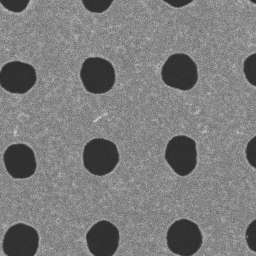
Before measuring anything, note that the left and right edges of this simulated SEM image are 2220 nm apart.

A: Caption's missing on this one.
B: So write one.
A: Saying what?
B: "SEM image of holes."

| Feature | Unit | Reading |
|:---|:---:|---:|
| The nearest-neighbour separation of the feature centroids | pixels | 81.2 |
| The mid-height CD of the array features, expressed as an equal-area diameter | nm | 318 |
